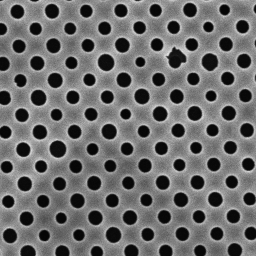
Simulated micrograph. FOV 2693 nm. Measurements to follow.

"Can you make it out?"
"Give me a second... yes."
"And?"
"a regular array of holes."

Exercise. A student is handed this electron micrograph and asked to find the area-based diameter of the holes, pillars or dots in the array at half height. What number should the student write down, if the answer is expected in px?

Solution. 13.3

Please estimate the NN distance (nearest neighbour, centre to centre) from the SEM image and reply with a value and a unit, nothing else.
251 nm